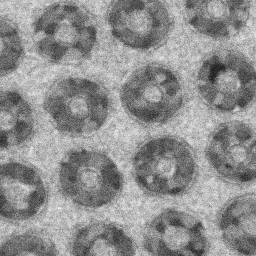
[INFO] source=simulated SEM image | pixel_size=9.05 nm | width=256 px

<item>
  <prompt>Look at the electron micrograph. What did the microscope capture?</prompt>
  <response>ring-shaped raised bodies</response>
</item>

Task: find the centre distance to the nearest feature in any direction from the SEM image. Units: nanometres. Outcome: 665